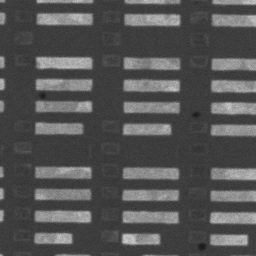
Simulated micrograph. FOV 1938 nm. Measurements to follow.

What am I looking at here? wiring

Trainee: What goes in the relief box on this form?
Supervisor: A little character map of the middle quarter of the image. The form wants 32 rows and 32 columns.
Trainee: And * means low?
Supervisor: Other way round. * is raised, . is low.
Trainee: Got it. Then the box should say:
*******........**************...
................................
................................
................................
*******........**************...
*******........**************...
.******........**************...
................................
................................
................................
*******........**************...
*******........**************...
................................
................................
................................
*****.....****.************.....
*****.....****.************.....
...............************.....
................................
................................
..........****..................
..........****..............*...
............................*...
................................
................................
..........***...................
*******...***..*************....
*******...***..*************....
..........................**....
................................
................................
******....***...................